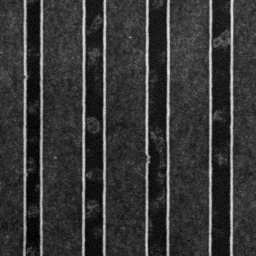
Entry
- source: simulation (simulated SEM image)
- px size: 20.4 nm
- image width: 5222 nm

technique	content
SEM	parallel lines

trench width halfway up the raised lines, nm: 423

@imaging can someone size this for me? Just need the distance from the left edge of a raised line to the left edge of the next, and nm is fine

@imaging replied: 1290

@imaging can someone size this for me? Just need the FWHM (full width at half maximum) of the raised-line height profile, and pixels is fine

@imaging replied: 42.4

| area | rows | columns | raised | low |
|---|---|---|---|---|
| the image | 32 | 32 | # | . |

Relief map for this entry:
###..#####...#####...#####...###
###..#####...#####...#####...###
###..#####...#####...#####...###
###..#####...#####...#####...###
###..#####...#####...#####...###
###..#####...#####...#####...###
###..#####...#####...#####...###
###..#####...#####...#####...###
###..#####...#####...#####...###
###..#####...#####...#####...###
###..#####...#####...#####...###
###..#####...#####...#####...###
###..#####...#####...#####...###
###..#####...#####...#####...###
###..#####...#####...#####...###
###..#####...#####...#####...###
###..#####...#####...#####...###
###..#####...#####...#####...###
###..#####...#####...#####...###
###..#####...#####...#####...###
###..#####...#####...#####...###
###..#####...#####...#####...###
###..#####...#####...#####...###
###..#####...#####...#####...###
###..#####...#####...#####...###
###..#####...#####...#####...###
###..#####...#####...#####...###
###..#####...#####...#####...###
###..#####...#####...#####...###
###..#####...#####...#####...###
###..#####...#####...#####...###
###..#####...#####...#####...###